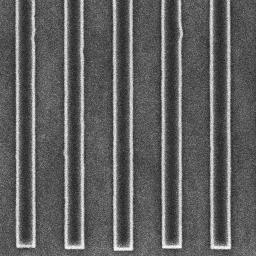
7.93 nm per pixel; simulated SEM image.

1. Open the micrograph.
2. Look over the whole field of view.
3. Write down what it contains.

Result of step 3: parallel lines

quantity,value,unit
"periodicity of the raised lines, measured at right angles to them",386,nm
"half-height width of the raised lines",138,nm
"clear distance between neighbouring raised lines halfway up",247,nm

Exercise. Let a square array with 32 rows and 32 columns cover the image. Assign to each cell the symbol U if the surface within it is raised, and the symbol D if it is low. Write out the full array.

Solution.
DDUUDDDDUUDDDDUUDDDDUUUDDDUUUDDD
DDUUDDDDUUDDDDUUDDDDUUUDDDUUUDDD
DDUUDDDDUUDDDDUUDDDDUUUDDDUUUDDD
DDUUDDDDUUDDDDUUDDDDUUUDDDUUUDDD
DDUUDDDDUUDDDDUUDDDDUUUDDDUUUDDD
DDUUDDDDUUDDDDUUDDDDUUUDDDUUUDDD
DDUUDDDDUUDDDDUUDDDDUUUDDDUUUDDD
DDUUDDDDUUDDDDUUDDDDUUUDDDUUUDDD
DDUUDDDDUUDDDDUUDDDDUUUDDDUUUDDD
DDUUDDDDUUDDDDUUDDDDUUUDDDUUUDDD
DDUUDDDDUUDDDDUUDDDDUUUDDDUUUDDD
DDUUDDDDUUDDDDUUDDDDUUUDDDUUUDDD
DDUUDDDDUUDDDDUUDDDDUUUDDDUUUDDD
DDUUDDDDUUDDDDUUDDDDUUUDDDUUUDDD
DDUUDDDDUUDDDDUUDDDDUUUDDDUUUDDD
DDUUDDDDUUDDDDUUDDDDUUUDDDUUUDDD
DDUUDDDDUUDDDDUUDDDDUUUDDDUUUDDD
DDUUDDDDUUDDDDUUDDDDUUUDDDUUUDDD
DDUUDDDDUUDDDDUUDDDDUUUDDDUUUDDD
DDUUDDDDUUDDDDUUDDDDUUDDDDUUUDDD
DDUUDDDDUUDDDDUUDDDDUUUDDDUUUDDD
DDUUDDDDUUDDDDUUDDDDUUUDDDUUUDDD
DDUUDDDDUUDDDDUUDDDDUUUDDDUUUDDD
DDUUDDDDUUDDDDUUDDDDUUUDDDUUUDDD
DDUUDDDDUUDDDDUUDDDDUUUDDDUUUDDD
DDUUDDDDUUDDDDUUDDDDUUUDDDUUUDDD
DDUUDDDDUUDDDDUUDDDDUUUDDDUUUDDD
DDUUDDDDUUDDDDUUDDDDUUDDDDUUUDDD
DDUUDDDDUUDDDDUUDDDDUUDDDDUUUDDD
DDUUDDDDUUDDDDUUDDDDUUUDDDUUUDDD
DDUUDDDDUUDDDDUUDDDDUUDDDDUUUDDD
DDDDDDDDDDDDDDDDDDDDDDDDDDDDDDDD